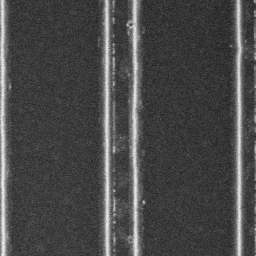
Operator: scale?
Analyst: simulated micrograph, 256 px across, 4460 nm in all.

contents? one or a few lines or trenches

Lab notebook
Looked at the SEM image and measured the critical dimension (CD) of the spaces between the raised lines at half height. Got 1.82 micrometres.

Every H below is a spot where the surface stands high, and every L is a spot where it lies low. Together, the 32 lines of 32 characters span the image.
LLLLLLLLLLLLLHHHHLLLLLLLLLLLLLHH
LLLLLLLLLLLLLHHHHLLLLLLLLLLLLLHH
LLLLLLLLLLLLLHHHHLLLLLLLLLLLLLHH
LLLLLLLLLLLLLHHHHLLLLLLLLLLLLLHH
LLLLLLLLLLLLLHHHHLLLLLLLLLLLLLHH
LLLLLLLLLLLLLHHHHLLLLLLLLLLLLLHH
LLLLLLLLLLLLLHHHHLLLLLLLLLLLLLHH
LLLLLLLLLLLLLHHHHLLLLLLLLLLLLLHH
LLLLLLLLLLLLLHHHHLLLLLLLLLLLLLHH
LLLLLLLLLLLLLHHHHLLLLLLLLLLLLLHH
LLLLLLLLLLLLLHHHHLLLLLLLLLLLLLHH
LLLLLLLLLLLLLHHHHLLLLLLLLLLLLLHH
LLLLLLLLLLLLLHHHHLLLLLLLLLLLLLHH
LLLLLLLLLLLLLHHHHLLLLLLLLLLLLLHH
LLLLLLLLLLLLLHHHHLLLLLLLLLLLLLHH
LLLLLLLLLLLLLHHHHLLLLLLLLLLLLLHH
LLLLLLLLLLLLLHHHHLLLLLLLLLLLLLHH
LLLLLLLLLLLLLHHHHLLLLLLLLLLLLLHH
LLLLLLLLLLLLLHHHHLLLLLLLLLLLLLHH
LLLLLLLLLLLLLHHHHLLLLLLLLLLLLLHH
LLLLLLLLLLLLLHHHHLLLLLLLLLLLLLHH
LLLLLLLLLLLLLHHHHLLLLLLLLLLLLLHH
LLLLLLLLLLLLLHHHHLLLLLLLLLLLLLHH
LLLLLLLLLLLLLHHHHLLLLLLLLLLLLLHH
LLLLLLLLLLLLLHHHHLLLLLLLLLLLLLHH
LLLLLLLLLLLLLHHHHLLLLLLLLLLLLLHH
LLLLLLLLLLLLLHHHHLLLLLLLLLLLLLHH
LLLLLLLLLLLLLHHHHLLLLLLLLLLLLLHH
LLLLLLLLLLLLLHHHHLLLLLLLLLLLLLHH
LLLLLLLLLLLLLHHHHLLLLLLLLLLLLLHH
LLLLLLLLLLLLLHHHHLLLLLLLLLLLLLHH
LLLLLLLLLLLLLHHHHLLLLLLLLLLLLLHH